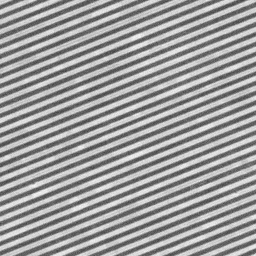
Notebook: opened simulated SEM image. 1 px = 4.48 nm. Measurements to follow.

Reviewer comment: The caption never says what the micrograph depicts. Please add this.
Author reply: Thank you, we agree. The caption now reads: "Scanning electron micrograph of parallel lines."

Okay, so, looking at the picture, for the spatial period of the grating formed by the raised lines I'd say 41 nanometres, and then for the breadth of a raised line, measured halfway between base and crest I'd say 0.0177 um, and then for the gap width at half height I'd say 26.5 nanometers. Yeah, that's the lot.